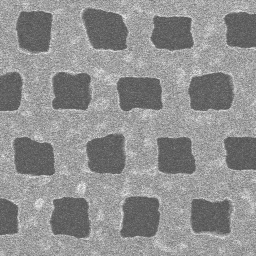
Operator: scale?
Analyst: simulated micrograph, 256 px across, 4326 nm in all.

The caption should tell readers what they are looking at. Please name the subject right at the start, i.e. a regular array of holes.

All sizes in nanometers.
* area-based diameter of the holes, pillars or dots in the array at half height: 705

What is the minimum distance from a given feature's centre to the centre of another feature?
1170 nanometers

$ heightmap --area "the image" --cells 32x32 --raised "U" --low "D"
UUUUUUUUUUUUUUUUUUUUUUUUUUUUUUUU
UUUDDDUUUUDDDDUUUUUUUUUUUUUUUUUU
UUDDDDUUUUDDDDDUUUUDDDDDUUUUDDDD
UUDDDDUUUUUDDDDDUUUDDDDDUUUUDDDD
UUDDDDUUUUUDDDDDUUUDDDDDUUUUDDDD
UUDDDDUUUUUDDDDDUUUDDDDDUUUUDDDD
UUUUDUUUUUUUUUUUUUUUUUUUUUUUUUUU
UUUUUUUUUUUUUUUUUUUUUUUUUUUUUUUU
UUUUUUUUUUUUUUUUUUUUUUUUUUUUUUUU
DDUUUUUDDDDUUUUUUUUUUUUUUDDDDUUU
DDDUUUUDDDDUUUUDDDDDUUUUDDDDDUUU
DDDUUUUDDDDUUUUDDDDDUUUDDDDDDUUU
DDDUUUUDDDDUUUUDDDDDUUUUDDDDDUUU
DDUUUUUDDDDUUUUDDDDDUUUUDDDDDUUU
UUUUUUUUUUUUUUUUUUUUUUUUUUUUUUUU
UUUUUUUUUUUUUUUUUUUUUUUUUUUUUUUU
UUUUUUUUUUUUUUUUUUUUUUUUUUUUUUUU
UUDDUUUUUUUDDDDDUUUUDDDDUUUUDDDD
UUDDDDDUUUUDDDDUUUUUDDDDUUUUDDDD
UUDDDDDUUUUDDDDDUUUUDDDDUUUUDDDD
UUDDDDDUUUUDDDDDUUUUDDDDUUUUDDDD
UUDDDDDUUUUUDDDUUUUUDDDDUUUUUUUU
UUUUUUUUUUUUUUUUUUUUUUUUUUUUUUUU
UUUUUUUUUUUUUUUUUUUUUUUUUUUUUUUU
UUUUUUUUUUUUUUUUUUUUUUUUUUUUUUUU
DDUUUUUDDDDUUUUDDDDDUUUUDDDDDUUU
DDUUUUUDDDDUUUUDDDDDUUUUDDDDDUUU
DDUUUUDDDDDUUUUDDDDDUUUUDDDDDUUU
DDUUUUDDDDDUUUUDDDDDUUUUDDDDDUUU
UUUUUUUUUDDUUUUDDDDUUUUUUUUUUUUU
UUUUUUUUUUUUUUUUUUUUUUUUUUUUUUUU
UUUUUUUUUUUUUUUUUUUUUUUUUUUUUUUU